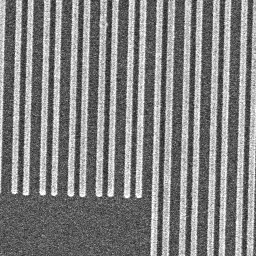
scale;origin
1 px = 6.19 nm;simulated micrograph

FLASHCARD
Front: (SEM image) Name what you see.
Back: parallel lines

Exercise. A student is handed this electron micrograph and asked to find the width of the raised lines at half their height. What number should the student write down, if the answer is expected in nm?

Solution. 34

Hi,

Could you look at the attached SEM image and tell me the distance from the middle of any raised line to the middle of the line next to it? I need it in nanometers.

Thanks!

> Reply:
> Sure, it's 86.6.